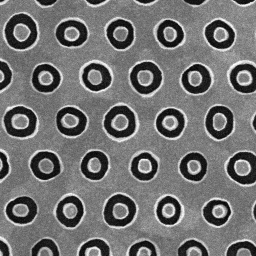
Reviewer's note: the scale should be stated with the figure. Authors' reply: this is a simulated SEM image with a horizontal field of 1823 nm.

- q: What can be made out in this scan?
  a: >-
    a regular array of ring-shaped grooves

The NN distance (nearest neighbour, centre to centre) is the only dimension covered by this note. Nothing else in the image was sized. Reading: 346 nm